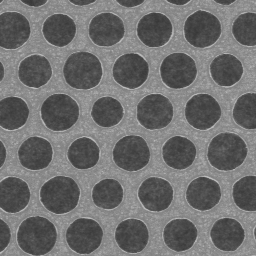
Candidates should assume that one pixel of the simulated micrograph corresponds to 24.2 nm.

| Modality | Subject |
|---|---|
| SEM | a regular array of holes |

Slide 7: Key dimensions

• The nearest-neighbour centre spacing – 1140 nanometres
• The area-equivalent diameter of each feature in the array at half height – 860 nm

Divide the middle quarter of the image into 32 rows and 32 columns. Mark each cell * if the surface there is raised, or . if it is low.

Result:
.........***.........***........
..........**.........***........
..........**.........***........
.........***.........***........
*........****.......*****.......
*.......******.....*******.....*
*****.**************************
**********************..********
..*******....*******......******
...*****......*****........****.
....***........***.........***..
....***........***.........***..
....***........***.........***..
....***........***.........****.
...*****......*****........****.
..*******...********......******
.********************.**********
********************************
****...********.....*******....*
**......*****........****.......
*........****........****.......
*........***.........****.......
*........***..........***.......
*........***.........****.......
*.......****.........****.......
**......*****.......******......
***************....*************
********************************
..*******************....*******
...******.....******......******
....***........****........****.
....***........****........****.